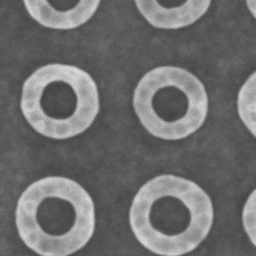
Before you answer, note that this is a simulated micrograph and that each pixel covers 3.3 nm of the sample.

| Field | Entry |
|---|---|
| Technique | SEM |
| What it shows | ring-shaped raised bodies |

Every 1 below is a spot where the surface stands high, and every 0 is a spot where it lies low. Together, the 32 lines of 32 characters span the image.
00011100001100000111000111000001
00001110111100000011111111000001
00000111111000000001111100000000
00000000000000000000000000000000
00000000000000000000000000000000
00000000000000000000000000000000
00000000000000000000000000000000
00000000000000000000000000000000
00000111100000000000110000000000
00001111111000000011111100000001
00011100011100000111111110000001
00011000011100000110000111000011
00011000001100000110000011000011
00011000001100000110000011000011
00011100011100000111000111000011
00001111111000000011111110000001
00000111110000000001111100000001
00000000000000000000000000000000
00000000000000000000000000000000
00000000000000000000000000000000
00000000000000000000000000000000
00000000000000000000000000000000
00000111000000000001111000000000
00001111110000000011111110000000
00011111111000000111111111000001
00111000011000000110000111000001
00110000011100001110000011000001
00111000011100001110000011000011
00111000011100000110000111000001
00011110111000000111101111000001
00011111110000000011111110000000
00000111100000000001111000000000